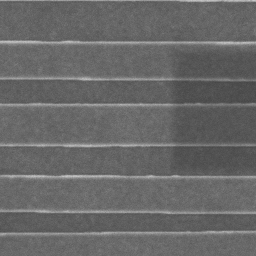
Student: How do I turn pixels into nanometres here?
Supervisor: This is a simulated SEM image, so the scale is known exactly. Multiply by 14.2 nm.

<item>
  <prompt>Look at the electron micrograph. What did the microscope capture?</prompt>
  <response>lines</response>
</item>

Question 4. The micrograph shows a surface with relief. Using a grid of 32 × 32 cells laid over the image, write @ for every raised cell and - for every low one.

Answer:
--------------------------------
--------------------------------
--------------------------------
--------------------------------
--------------------------------
@@@@@@@@@@@@@@@@@@@@@@@@@@@@@@@@
@@@@@@@@@@@@@@@@@@@@@@@@@@@@@@@@
@@@@@@@@@@@@@@@@@@@@@@@@@@@@@@@@
@@@@@@@@@@@@@@@@@@@@@@@@@@@@@@@@
@@@@@@@@@@@@@@@@@@@@@@@@@@@@@@@@
--------------------------------
--------------------------------
--------------------------------
@@@@@@@@@@@@@@@@@@@@@@@@@@@@@@@@
@@@@@@@@@@@@@@@@@@@@@@@@@@@@@@@@
@@@@@@@@@@@@@@@@@@@@@@@@@@@@@@@@
@@@@@@@@@@@@@@@@@@@@@@@@@@@@@@@@
@@@@@@@@@@@@@@@@@@@@@@@@@@@@@@@@
--------------------------------
--------------------------------
--------------------------------
--------------------------------
@@@@@@@@@@@@@@@@@@@@@@@@@@@@@@@@
@@@@@@@@@@@@@@@@@@@@@@@@@@@@@@@@
@@@@@@@@@@@@@@@@@@@@@@@@@@@@@@@@
@@@@@@@@@@@@@@@@@@@@@@@@@@@@@@@@
-----@@@@@@@@@@@@@@@@@@@@@@@@@@@
--------------------------------
--------------------------------
@@@@@@@@@@@@@@@@@@@@@@@@@@@@@@@@
@@@@@@@@@@@@@@@@@@@@@@@@@@@@@@@@
@@@@@@@@@@@@@@@@@@@@@@@@@@@@@@@@